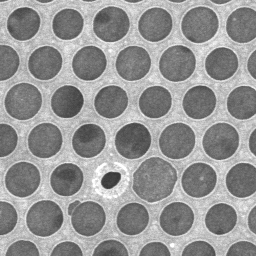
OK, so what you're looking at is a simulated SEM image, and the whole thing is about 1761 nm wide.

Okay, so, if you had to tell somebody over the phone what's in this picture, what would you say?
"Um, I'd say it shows a regular array of holes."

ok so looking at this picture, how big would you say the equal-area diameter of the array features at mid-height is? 241 nm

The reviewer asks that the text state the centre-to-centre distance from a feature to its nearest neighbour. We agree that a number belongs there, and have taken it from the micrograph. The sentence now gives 302 nanometers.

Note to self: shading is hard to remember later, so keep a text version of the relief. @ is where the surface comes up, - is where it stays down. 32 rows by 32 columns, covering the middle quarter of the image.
@@---------@@---------@@--------
@@--------@@@--------@@@--------
@@@------@@@@@-------@@@--------
@@@@----@@@@@@------@@@@@------@
@@@@@@@@@@@@@@@@@@@@@@@@@@@-@@@@
--@@@@@@@@@---@@@@@@@@--@@@@@@@@
----@@@@@------@@@@@------@@@@@-
-----@@@--------@@@--------@@@--
-----@@@--------@@@--------@@@--
-----@@---------@@@--------@@@--
-----@@@--------@@@--------@@@--
----@@@@-------@@@@-------@@@@--
---@@@@@@-----@@@@@@------@@@@--
-@@@@@@@@@@-@@@@@@@@@---@@@@@@@@
@@@@@@@@@@@@@@@@@@@@@@@@@@@@-@@@
@@@@-----@@@@@@-----@@@@@@-----@
@@@-------@@@@-------@@@@-------
@@--------@@@---------@@--------
@@--------@@@---------@@--------
@@--------@@@---------@@--------
@@--------@@@--------@@@--------
@@--------@@@--------@@@--------
@@@------@@@@@------@@@@@-------
@@@@@--@@@@@@@@----@@---@@----@@
@@@@@@@@@@@@@@@@@@@@------@@@@@@
---@@@@@@@@@@@@@@@@--------@@@@-
----@@@@@@@@@@@@@@----------@@--
-----@@@@@----@@@-----------@@--
-----@@@@@----@@@---------------
-----@@@@-----@@@-----------@---
----@@@@@@---@@@@-----------@---
----@@@@@@@@@@@@@----------@@@--